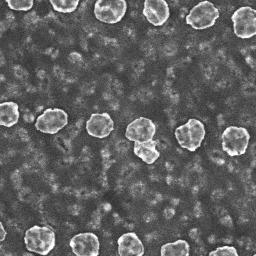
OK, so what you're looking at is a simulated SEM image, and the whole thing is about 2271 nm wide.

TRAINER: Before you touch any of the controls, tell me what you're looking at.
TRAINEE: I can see raised bodies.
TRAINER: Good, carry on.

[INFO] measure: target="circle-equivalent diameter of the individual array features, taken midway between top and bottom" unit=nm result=249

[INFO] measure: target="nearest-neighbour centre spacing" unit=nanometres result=401